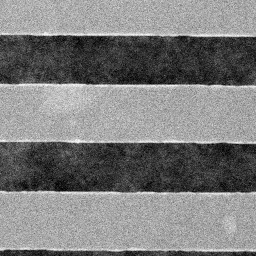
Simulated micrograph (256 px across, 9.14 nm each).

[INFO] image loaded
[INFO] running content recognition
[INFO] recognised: lines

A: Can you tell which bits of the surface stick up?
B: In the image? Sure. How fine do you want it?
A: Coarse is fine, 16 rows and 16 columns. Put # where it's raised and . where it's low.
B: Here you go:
################
################
................
................
................
################
################
################
################
................
................
................
################
################
################
################